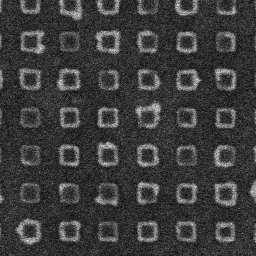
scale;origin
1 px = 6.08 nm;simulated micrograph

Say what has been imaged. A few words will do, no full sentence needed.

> a regular array of raised bodies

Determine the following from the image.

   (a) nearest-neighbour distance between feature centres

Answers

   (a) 229 nanometres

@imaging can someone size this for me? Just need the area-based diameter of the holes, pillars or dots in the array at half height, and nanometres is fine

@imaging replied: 134